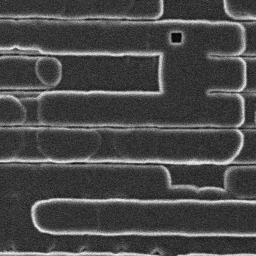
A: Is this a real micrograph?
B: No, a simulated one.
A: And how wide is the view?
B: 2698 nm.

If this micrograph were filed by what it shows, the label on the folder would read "wiring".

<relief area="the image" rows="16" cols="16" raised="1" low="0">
1111111111000011
1111111111111110
1111111111111110
0000000000111110
0000000000111110
0000000000111110
1111111111111110
1111111111111110
1111111111111110
1111111111111110
0000000000000000
0000000000000000
0001110100000000
0011111111111111
0001111111111111
0000000000000000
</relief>